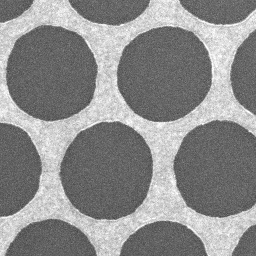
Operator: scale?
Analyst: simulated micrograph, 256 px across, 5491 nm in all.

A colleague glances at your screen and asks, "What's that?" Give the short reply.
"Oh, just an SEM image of holes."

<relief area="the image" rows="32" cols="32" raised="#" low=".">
....#####..........####.........
...######.........#####.........
..#########......########......#
####....###########....#########
###.......#######........######.
##.........#####..........####..
#...........###...........###...
#...........###...........###...
#...........###............##...
#...........###............##...
#...........###............##...
#...........###...........###...
#...........####.........#####..
##.........#####.........#####..
####.....########......#########
.###########....#########.....##
...#######.......#######.......#
....#####.........#####.........
.....###...........###..........
.....###...........###..........
.....###...........###..........
.....##............###..........
.....##............###..........
.....###...........###..........
....####..........#####.........
....#####.........#####.........
..########.......########......#
######..####...#################
###.......#######.......#######.
##.........#####.........#####..
#...........###...........####..
#...........###...........###...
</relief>